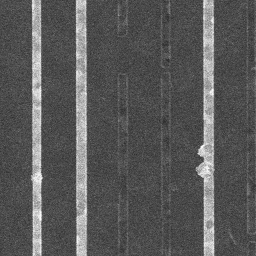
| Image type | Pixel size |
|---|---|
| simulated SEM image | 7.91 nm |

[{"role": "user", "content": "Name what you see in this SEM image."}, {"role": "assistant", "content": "parallel lines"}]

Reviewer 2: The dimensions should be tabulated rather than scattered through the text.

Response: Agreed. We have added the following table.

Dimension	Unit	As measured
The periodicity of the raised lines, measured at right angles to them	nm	339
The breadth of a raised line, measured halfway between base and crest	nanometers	66.2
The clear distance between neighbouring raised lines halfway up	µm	0.273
